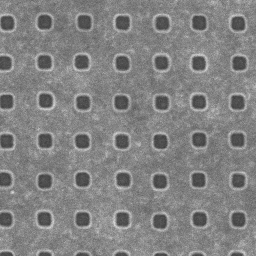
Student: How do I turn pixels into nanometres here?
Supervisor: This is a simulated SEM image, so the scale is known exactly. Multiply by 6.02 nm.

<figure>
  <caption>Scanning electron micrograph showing a regular array of holes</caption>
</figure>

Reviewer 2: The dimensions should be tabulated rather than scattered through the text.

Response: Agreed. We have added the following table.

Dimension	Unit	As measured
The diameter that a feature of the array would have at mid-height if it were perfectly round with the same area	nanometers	95.9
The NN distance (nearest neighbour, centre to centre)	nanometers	226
